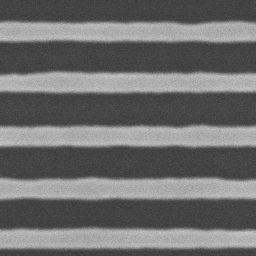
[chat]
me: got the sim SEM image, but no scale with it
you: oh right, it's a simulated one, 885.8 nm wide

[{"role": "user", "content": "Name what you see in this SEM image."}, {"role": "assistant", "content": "lines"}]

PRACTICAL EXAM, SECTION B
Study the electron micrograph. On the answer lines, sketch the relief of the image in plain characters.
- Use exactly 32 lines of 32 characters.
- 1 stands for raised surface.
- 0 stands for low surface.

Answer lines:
00000000000000000000000000000000
00000000000000000000000000000000
00000000000000000000000000000000
11111111111111111111111111111111
11111111111111111111111111111111
00000000000000000000000000000000
00000000000000000000000000000000
00000000000000000000000000000000
00000000000000000000000000000000
11111111111111111111111111111111
11111111111111111111111111111111
00000000000000000000000000000000
00000000000000000000000000000000
00000000000000000000000000000000
00000000000000000000000000000000
00000000000000000000000000000000
11111111111111111111111111111111
11111111111111111111111111111111
00000000000000000000000000000000
00000000000000000000000000000000
00000000000000000000000000000000
00000000000000000000000000000000
11000011011111000011111111110000
11111111111111111111111111111111
11111111111111111111111111111111
00000000000000000000000000000000
00000000000000000000000000000000
00000000000000000000000000000000
00000000000000000000000000000000
11111111111111111111111111111111
11111111111111111111111111111111
00000000000000000000000000000000